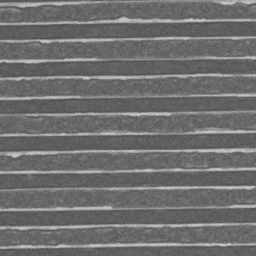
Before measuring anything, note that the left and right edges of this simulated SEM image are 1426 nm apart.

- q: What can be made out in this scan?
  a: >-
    parallel lines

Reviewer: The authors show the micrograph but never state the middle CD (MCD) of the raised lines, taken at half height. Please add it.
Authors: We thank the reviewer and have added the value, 123 nm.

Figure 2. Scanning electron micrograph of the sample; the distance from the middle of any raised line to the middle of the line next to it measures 208 nanometers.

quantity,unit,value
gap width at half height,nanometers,85